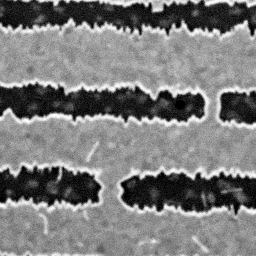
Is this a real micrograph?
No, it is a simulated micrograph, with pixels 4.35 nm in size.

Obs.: one or a few lines or trenches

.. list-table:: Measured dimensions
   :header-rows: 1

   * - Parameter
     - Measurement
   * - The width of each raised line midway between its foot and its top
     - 54.4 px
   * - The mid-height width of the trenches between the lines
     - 142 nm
